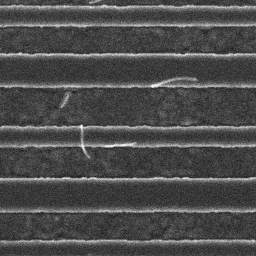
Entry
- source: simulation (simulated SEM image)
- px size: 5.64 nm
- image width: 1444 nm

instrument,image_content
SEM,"lines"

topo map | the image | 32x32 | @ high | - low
--------------------------------
@@@@@@@@@@@@@@@@@@@@@@@@@@@@@@@@
@@@@@@@@@@@@@@@@@@@@@@@@@@@@@@@@
--------------------------------
--------------------------------
--------------------------------
--------------------------------
@@@@@@@@@@@@@@@@@@@@@@@@@@@@@@@@
@@@@@@@@@@@@@@@@@@@@@@@@@@@@@@@@
@@@@@@@@@@@@@@@@@@@@@@@@@@@@@@@@
@@@@@@@@@@@@@@@@@@@@@@@@@@@@@@@@
--------------------------------
----@---------------------------
--------------------------------
--------------------------------
-----------------------@--------
@@@@@@@@@@@@@@@@@@@@@@@@@@@@@@@@
@@@@@@@@@@@@@@@@@@@@@@@@@@@@@@@@
--------------------------------
--------------------------------
--------------------------------
--------------------------------
@@@@@@@@@@@@@@@@@@@@@@@@@@@@@@@@
@@@@@@@@@@@@@@@@@@@@@@@@@@@@@@@@
@@@@@@@@@@@@@@@@@@@@@@@@@@@@@@@@
@@@@@@@@@@@@@@@@@@@@@@@@@@@@@@@@
------@-------------------------
---@----------------------------
---@@---------------------------
--------------------------------
@@@@@@@@@@@@@@@@@@@@@@@@@@@@@@@@
@@@@@@@@@@@@@@@@@@@@@@@@@@@@@@@@